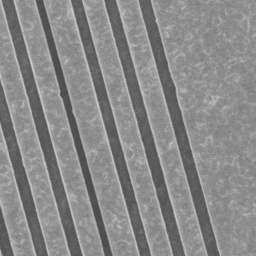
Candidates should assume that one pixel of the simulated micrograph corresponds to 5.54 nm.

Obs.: parallel lines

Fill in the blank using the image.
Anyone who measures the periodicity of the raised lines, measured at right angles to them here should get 0.183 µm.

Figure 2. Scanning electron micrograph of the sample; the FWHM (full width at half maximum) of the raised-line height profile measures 112 nm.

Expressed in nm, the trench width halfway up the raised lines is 69.5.